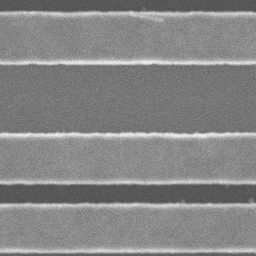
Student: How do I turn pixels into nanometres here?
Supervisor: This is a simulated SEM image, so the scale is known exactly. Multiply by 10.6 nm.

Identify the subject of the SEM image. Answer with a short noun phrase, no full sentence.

lines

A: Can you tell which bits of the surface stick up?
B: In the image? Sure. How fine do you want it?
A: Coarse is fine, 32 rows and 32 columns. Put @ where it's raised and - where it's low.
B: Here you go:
--------------------------------
-@@@@@@--@-@@@@@@@@@-@-@@@@-@@@-
@@@@@@@@@@@@@@@@@@@@@@@@@@@@@@@@
@@@@@@@@@@@@@@@@@@@@@@@@@@@@@@@@
@@@@@@@@@@@@@@@@@@@@@@@@@@@@@@@@
@@@@@@@@@@@@@@@@@@@@@@@@@@@@@@@@
@@@@@@@@@@@@@@@@@@@@@@@@@@@@@@@@
@@@@@@@@@@@@@@@@@@@@@@@@@@@@@@@@
--------------------------------
--------------------------------
--------------------------------
--------------------------------
--------------------------------
--------------------------------
--------------------------------
--------------------------------
--------------------------------
@@@@@@@@@@@@@@@@@@@@@@@@@@@@@@@@
@@@@@@@@@@@@@@@@@@@@@@@@@@@@@@@@
@@@@@@@@@@@@@@@@@@@@@@@@@@@@@@@@
@@@@@@@@@@@@@@@@@@@@@@@@@@@@@@@@
@@@@@@@@@@@@@@@@@@@@@@@@@@@@@@@@
@@@@@@@@@@@@@@@@@@@@@@@@@@@@@@@@
--------------------------------
--------------------------------
@@@@@@@@@@@@@@@@@@@@@@@@@@@@@@@@
@@@@@@@@@@@@@@@@@@@@@@@@@@@@@@@@
@@@@@@@@@@@@@@@@@@@@@@@@@@@@@@@@
@@@@@@@@@@@@@@@@@@@@@@@@@@@@@@@@
@@@@@@@@@@@@@@@@@@@@@@@@@@@@@@@@
@@@@@@@@@@@@@@@@@@@@@@@@@@@@@@@@
--@@@@@@@@@@-@-@----------------